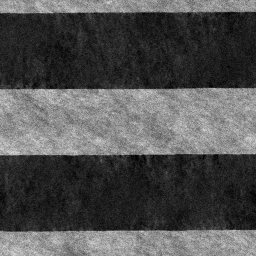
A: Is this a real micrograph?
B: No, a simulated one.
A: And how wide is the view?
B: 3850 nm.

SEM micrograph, one or a few lines or trenches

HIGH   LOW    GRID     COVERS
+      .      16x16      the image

++++++++++++++++
................
................
................
................
+...............
++++++++++++++++
++++++++++++++++
++++++++++++++++
++++++++++++++++
................
................
................
................
++++++++++++++++
++++++++++++++++